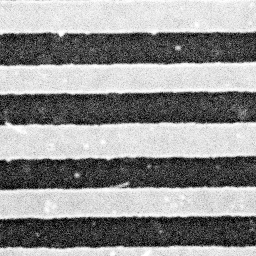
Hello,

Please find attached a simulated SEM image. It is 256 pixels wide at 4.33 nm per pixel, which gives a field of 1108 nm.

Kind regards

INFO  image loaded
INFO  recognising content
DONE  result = lines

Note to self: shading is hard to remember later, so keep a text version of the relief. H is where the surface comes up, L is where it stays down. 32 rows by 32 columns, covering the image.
HHHHHHHHHHHHHHHHHHHHHHHHHHHHHHHH
HHHHHHHHHHHHHHHHHHHHHHHHHHHHHHHH
HHHHHHHHHHHHHHHHHHHHHHHHHHHHHHHH
HHHHHHHHHHHHHHHHHHHHHHHHHHHHHHHH
LLLLLLLLLLLLLLLLLLLLLLLLLLLLLLLL
LLLLLLLLLLLLLLLLLLLLLLLLLLLLLLLL
LLLLLLLLLLLLLLLLLLLLLLLLLLLLLLLL
LLLLLLLLLLLLLLLLLLLLLLLLLLLLLLLL
HHHHHHHHHHHHHHHHHHHHHHHHHHHHHHHH
HHHHHHHHHHHHHHHHHHHHHHHHHHHHHHHH
HHHHHHHHHHHHHHHHHHHHHHHHHHHHHHHH
HHHHHHHHHHHHHLLLLLLLLLLLLLLLLLLL
LLLLLLLLLLLLLLLLLLLLLLLLLLLLLLLL
LLLLLLLLLLLLLLLLLLLLLLLLLLLLLLLL
LLLLLLLLLLLLLLLLLLLLLLLLLLLLLLLL
LLLLLLLLLLLLLLLLLHLLHHHHHLLLLHHH
HHHHHHHHHHHHHHHHHHHHHHHHHHHHHHHH
HHHHHHHHHHHHHHHHHHHHHHHHHHHHHHHH
HHHHHHHHHHHHHHHHHHHHHHHHHHHHHHHH
HHHHHHHHHHHHHHHHHLHHHHLHHHHLLLLL
LLLLLLLLLLLLLLLLLLLLLLLLLLLLLLLL
LLLLLLLLLLLLLLLLLLLLLLLLLLLLLLLL
LLLLLLLLLLLLLLLLLLLLLLLLLLLLLLLL
LLLLLLLLLLLLLLLLLLLLLLLLLLLLHLLL
HHHHHHHHHHHHHHHHHHHHHHHHHHHHHHHH
HHHHHHHHHHHHHHHHHHHHHHHHHHHHHHHH
HHHHHHHHHHHHHHHHHHHHHHHHHHHHHHHH
LLLLLLLLLLLLLLLLLLLLLLLLLLLLLLLL
LLLLLLLLLLLLLLLLLLLLLLLLLLLLLLLL
LLLLLLLLLLLLLLLLLLLLLLLLLLLLLLLL
LLLLLLLLLLLLLLLLLLLLLLLLLLLLLLLL
HHHHHHHHHHHHHHHHHHHHHHHHHHHHHHHH